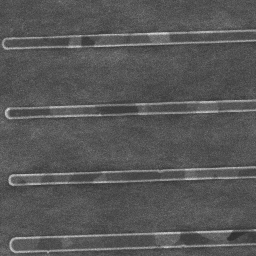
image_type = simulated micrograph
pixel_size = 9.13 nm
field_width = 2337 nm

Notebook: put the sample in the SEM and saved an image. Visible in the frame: one or a few lines or trenches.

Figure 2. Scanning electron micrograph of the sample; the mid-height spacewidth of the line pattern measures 57.1 px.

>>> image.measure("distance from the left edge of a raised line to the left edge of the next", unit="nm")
614